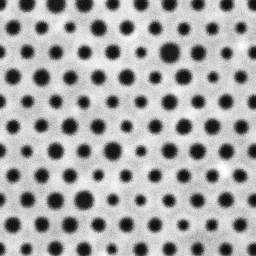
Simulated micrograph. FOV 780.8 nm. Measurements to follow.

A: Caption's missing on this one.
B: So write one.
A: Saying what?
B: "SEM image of a regular array of holes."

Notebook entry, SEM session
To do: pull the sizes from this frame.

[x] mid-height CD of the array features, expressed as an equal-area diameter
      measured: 48 nm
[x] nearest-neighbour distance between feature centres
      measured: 85.6 nm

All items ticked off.